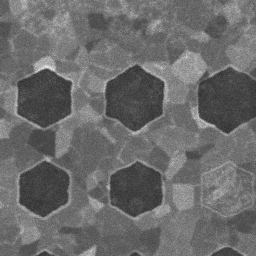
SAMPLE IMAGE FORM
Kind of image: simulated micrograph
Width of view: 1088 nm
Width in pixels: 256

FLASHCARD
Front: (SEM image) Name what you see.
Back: holes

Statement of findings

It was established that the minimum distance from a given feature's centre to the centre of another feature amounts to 385 nm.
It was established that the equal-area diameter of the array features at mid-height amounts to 239 nm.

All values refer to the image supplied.